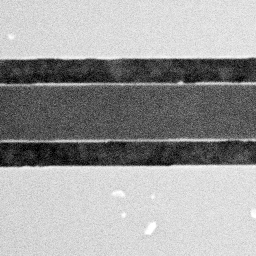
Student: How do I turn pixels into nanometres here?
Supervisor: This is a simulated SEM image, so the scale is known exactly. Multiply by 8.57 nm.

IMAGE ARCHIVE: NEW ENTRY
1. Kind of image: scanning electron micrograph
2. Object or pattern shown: lines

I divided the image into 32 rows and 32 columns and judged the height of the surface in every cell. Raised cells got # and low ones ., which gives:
################################
################################
################################
################################
################################
################################
################################
................................
................................
................................
......................#.#####.##
################################
################################
################################
################################
################################
################################
#############################.##
................................
................................
................................
################################
################################
################################
################################
################################
################################
################################
################################
################################
################################
################################